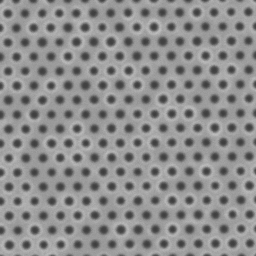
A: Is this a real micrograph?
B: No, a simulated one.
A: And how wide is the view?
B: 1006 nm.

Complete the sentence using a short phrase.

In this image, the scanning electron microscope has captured a regular array of holes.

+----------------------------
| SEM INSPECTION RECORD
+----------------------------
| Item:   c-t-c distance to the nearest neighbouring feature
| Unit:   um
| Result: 0.0651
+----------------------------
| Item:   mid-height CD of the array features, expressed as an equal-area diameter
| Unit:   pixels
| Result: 8.3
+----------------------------